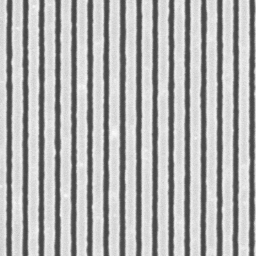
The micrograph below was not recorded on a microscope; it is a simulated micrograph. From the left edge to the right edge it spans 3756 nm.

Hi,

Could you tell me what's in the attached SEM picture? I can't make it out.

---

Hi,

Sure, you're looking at parallel lines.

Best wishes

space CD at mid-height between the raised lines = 5.88 pixels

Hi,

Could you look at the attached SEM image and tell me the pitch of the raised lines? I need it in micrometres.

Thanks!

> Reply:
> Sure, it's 0.237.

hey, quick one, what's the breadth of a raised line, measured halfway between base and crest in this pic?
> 0.156 microns